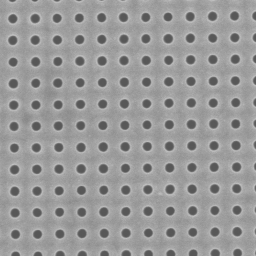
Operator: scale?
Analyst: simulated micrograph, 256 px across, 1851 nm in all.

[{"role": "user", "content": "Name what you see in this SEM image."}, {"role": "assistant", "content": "a regular array of holes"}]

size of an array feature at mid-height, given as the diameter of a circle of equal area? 63.8 nm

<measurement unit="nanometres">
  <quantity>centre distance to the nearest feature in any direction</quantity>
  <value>155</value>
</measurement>